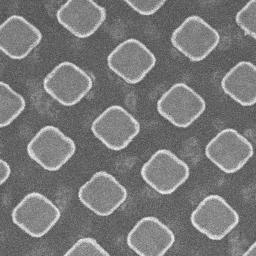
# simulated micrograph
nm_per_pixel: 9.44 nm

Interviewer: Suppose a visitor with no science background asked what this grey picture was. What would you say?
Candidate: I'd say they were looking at a regular array of raised bodies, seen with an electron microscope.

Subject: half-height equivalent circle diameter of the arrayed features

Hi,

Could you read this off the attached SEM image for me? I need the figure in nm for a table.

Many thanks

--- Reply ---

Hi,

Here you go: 385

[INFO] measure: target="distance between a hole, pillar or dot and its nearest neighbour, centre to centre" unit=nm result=626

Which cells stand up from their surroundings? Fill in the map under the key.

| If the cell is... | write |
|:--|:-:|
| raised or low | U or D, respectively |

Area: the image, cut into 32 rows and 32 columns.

DDDDDDDDUUUUDDDDUUUUDDDDDDDDDDDU
DDDDDDDUUUUUUDDDDUUDDDDDDDDDDDUU
DUUDDDDUUUUUUDDDDDDDDDDDUDDDDDUU
UUUUDDDDUUUUDDDDDDDDDDUUUUDDDDUU
UUUUUDDDDDUDDDDDDDDDDDUUUUUDDDDD
UUUUUDDDDDDDDDDUUUDDDDUUUUUDDDDD
DUUUDDDDDDDDDDUUUUUDDDDUUUDDDDDD
DDDDDDDDDDDDDDUUUUUDDDDDUDDDDDDD
DDDDDDDUUUDDDDUUUUUDDDDDDDDDDUUU
DDDDDDUUUUUDDDDUUUDDDDDDDDDDUUUU
DDDDDDUUUUUDDDDDDDDDDDDDDDDDUUUU
UUDDDDUUUUUDDDDDDDDDDUUUDDDDUUUU
UUUDDDDUUUDDDDDDDDDDUUUUUDDDDDUU
UUUDDDDDDDDDDDUDDDDDUUUUUDDDDDDD
UUDDDDDDDDDDDUUUDDDDDUUUUDDDDDDD
UDDDDDDDDDDDUUUUUDDDDDUUDDDDDDDD
DDDDDUUDDDDDUUUUUDDDDDDDDDDDUDDD
DDDDUUUUUDDDDUUUDDDDDDDDDDDUUUUD
DDDDUUUUUDDDDDUDDDDDDDDDDDUUUUUD
DDDDUUUUUDDDDDDDDDDUUUDDDDUUUUUD
UDDDDUUUDDDDDDDDDDUUUUUDDDDUUUDD
UDDDDDDDDDDDDDDDDDUUUUUDDDDDDDDD
DDDDDDDDDDDUUUDDDDUUUUUDDDDDDDDD
DDDDDDDDDDUUUUUDDDDUUUDDDDDDDDDD
DDDDUDDDDDUUUUUUDDDDDDDDDDDDDDDD
DDDUUUDDDDDUUUUDDDDDDDDDDUUUDDDD
DDUUUUUDDDDDUUDDDDDDDDDDUUUUUDDD
DDUUUUUDDDDDDDDDDDUUDDDDUUUUUUDD
DDDUUUDDDDDDDDDDDUUUUDDDDUUUUDDD
DDDDDDDDDDDDDDDDUUUUUUDDDDUUDDDD
DDDDDDDDDDUUDDDDUUUUUDDDDDDDDDDD
DDDDDDDDDUUUUDDDDUUUUDDDDDDDDDDU